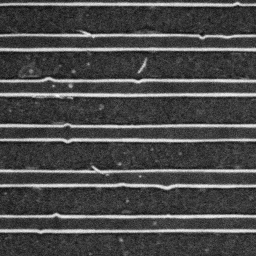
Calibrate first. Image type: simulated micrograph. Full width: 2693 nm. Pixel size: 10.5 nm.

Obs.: parallel lines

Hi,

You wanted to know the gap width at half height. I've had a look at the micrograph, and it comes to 326 nm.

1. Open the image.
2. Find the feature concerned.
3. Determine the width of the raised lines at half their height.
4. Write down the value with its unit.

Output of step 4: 0.147 micrometres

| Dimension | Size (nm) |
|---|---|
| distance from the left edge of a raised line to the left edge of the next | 476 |